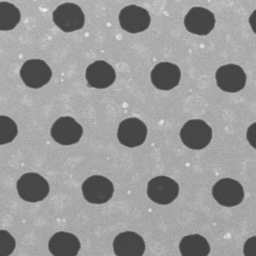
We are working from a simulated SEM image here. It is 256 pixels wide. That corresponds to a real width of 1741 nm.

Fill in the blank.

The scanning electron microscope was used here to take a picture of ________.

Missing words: a regular array of holes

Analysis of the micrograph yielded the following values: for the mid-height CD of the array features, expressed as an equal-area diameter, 0.206 um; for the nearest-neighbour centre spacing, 441 nm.